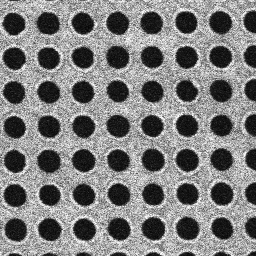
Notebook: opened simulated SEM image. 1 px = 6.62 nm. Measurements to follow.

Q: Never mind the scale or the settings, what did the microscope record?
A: a regular array of holes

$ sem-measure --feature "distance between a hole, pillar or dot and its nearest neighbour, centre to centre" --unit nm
225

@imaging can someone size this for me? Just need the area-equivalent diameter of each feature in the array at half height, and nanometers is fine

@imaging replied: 150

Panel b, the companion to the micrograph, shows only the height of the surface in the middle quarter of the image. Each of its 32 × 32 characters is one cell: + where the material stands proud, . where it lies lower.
+++....++++....+++++....+++++...
++++++++++++++++++++++++++++++++
++++++++++++++++++++++++++++++++
++++++++++++++++++++++++++++++++
+++...++++++...++++++..++++++...
++.....++++.....++++....++++....
++.....++++.....+++......+++....
++......+++.....++++.....+++....
++.....++++.....++++.....++++...
+++....++++++.++++++++.+++++++++
++++++++++++++++++++++++++++++++
++++++++++++++++++++++++++++++++
++++++++++++++++++++++++++++++++
+++....++++....+++++....+++++...
++.....++++.....+++.....++++....
++......+++.....+++......+++....
++......+++.....++++.....+++....
+++....++++.....++++....+++++...
+++++.++++++++++++++++++++++++++
++++++++++++++++++++++++++++++++
++++++++++++++++++++++++++++++++
+++...+++++++..++++++..+++++++..
++.....++++.....++++.....+++....
++......+++.....+++......+++....
++......+++......++......+++....
++......+++.....++++.....+++....
+++....+++++....+++++...+++++...
++++++++++++++++++++++++++++++++
++++++++++++++++++++++++++++++++
++++++++++++++++++++++++++++++++
+++....+++++...+++++....+++++...
++.....++++.....++++.....+++....